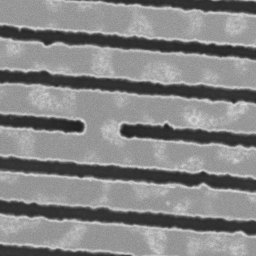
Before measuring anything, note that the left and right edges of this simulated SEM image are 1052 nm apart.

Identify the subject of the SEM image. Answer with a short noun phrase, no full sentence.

parallel lines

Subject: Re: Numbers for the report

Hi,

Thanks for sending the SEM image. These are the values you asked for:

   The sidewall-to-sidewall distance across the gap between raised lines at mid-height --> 51.1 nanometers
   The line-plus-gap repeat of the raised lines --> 179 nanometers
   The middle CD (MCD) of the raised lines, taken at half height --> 131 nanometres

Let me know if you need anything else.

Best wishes